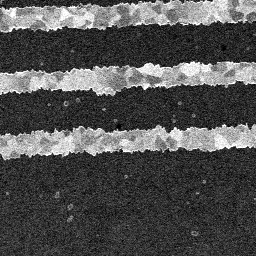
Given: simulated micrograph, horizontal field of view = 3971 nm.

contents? one or a few lines or trenches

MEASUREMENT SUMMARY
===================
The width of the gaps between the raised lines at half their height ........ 0.662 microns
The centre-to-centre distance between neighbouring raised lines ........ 979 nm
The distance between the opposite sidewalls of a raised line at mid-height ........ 322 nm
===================